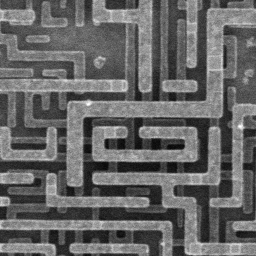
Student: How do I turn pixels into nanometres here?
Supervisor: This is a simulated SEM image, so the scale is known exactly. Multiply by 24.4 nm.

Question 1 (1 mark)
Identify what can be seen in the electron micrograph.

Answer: wiring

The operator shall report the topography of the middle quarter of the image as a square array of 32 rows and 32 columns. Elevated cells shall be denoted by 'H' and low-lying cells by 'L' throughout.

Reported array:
LLLLLLLLLLLLLLLLLLLHHHLLLLLLLLLH
LLLLLLLLLLLLLLLLLLLHHHLLLLLLLLLL
LLLLLLLLLLLLLLLLLLLHHHLLLLLLLLLL
LLLLLLLLLLLLLLLLLLLHHHLLLLLLLLLL
HHHHHHHHHHHHHHHHLLLHHHLLLHHHHHHH
HHHHHHHHHHHHHHHHLLLHHHLLLHHHHHHH
HHHHHHHHHHHHHHHHLLLHHHLLLHHHHHHH
LLLLLLLLLLLLLLLLLLLLLLLLLLLLLLLL
LLLLLLLLLLLLLLLLLLLLLLLLLLLLLLLL
LHHHHHHLLLLHHHHHLLLLLLLLLLLLLLLL
LHHHHHHHHHHHHHHHHHHHHHHHHHHHHHHH
LHHHHHHHHHHHHHHHHHHHHHHHHHHHHHHH
LHHHHHHHHHHHHHHHHHHHHHHHHHHHHHHH
LHHHHLLLLLLLLLLLLLLLLLLLLLLLLLLL
LHHHHLLLLLLLLLLLLLLLLLLLLLLLLLLL
LHHHHLLLLLLLLLLLLLLLLLLLLLLLLLLL
LHHHHLLHHHHHHHHHLLLHHHHHHHHHHHHH
LHHHHLLHHHHHHHHHLLLHHHHHHHHHHHHH
LHHHHLLHHHHLLLLLLLLLLLLLLLLLLHHH
LHHHHLLHHHLLLLLLLLLLLLLLLLLLLLHH
LHHHHLLHHHLLLLLLLLLLLLLLLLLLLLHH
LHHHHLLHHHHLLLLLLLLLLLLLLLLLLLHH
LHHHHLLHHHHHHHHHHHHHHHHHHHHHHHHH
LHHHHLLHHHHHHHHHHHHHHHHHHHHHHHHH
LHHHHLLLLLLLLLLLLLLLLLLLLLLLLLLL
LHHHHLLLLLLLLLLLLLLLLLLLLLLLLLLL
LHHHHLLLLLLLLLLLLLLLLLLLLLLLLLLL
LHHHHLLLHHHHHHHHHHHHHHHHHHHLLHHH
LHHHHLLHHHHHHHHHHHHHHHHHHHHHHHHH
LHHHHLLHHHHHHHHHHHHHHHHHHHHHHHHH
LLLLLLLLLLLLLLLLLLLLLLLLHHHHLLLL
LLLLLLLLLLLLLLLLLLLLLLLLLHHLLLLL